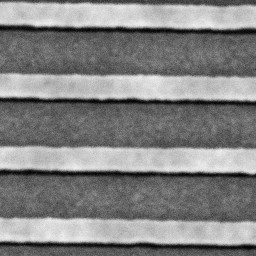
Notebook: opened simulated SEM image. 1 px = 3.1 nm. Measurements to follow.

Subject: lines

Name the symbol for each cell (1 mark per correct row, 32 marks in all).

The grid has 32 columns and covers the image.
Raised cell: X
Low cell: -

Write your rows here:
XXXXXXXXX-XX--------------------
XXXXXXXXXXXXXXXXXXXXXXXXXXXXXXXX
XXXXXXXXXXXXXXXXXXXXXXXXXXXXXXXX
---------------------XXXXXXXXX-X
--------------------------------
--------------------------------
--------------------------------
--------------------------------
--------------------------------
XXXXXXXXXXX------X--------------
XXXXXXXXXXXXXXXXXXXXXXXXXXXXXXXX
XXXXXXXXXXXXXXXXXXXXXXXXXXXXXXXX
-------------------------------X
--------------------------------
--------------------------------
--------------------------------
--------------------------------
--------------------------------
XXXXXXXXXXXXXX------------------
XXXXXXXXXXXXXXXXXXXXXXXXXXXXXXXX
XXXXXXXXXXXXXXXXXXXXXXXXXXXXXXXX
--------------------XX-XXXXXXXXX
--------------------------------
--------------------------------
--------------------------------
--------------------------------
--------------------------------
XXXXXXXXXXXXX-------------------
XXXXXXXXXXXXXXXXXXXXXXXXXXXXXXXX
XXXXXXXXXXXXXXXXXXXXXXXXXXXXXXXX
---------------------------XXX--
--------------------------------